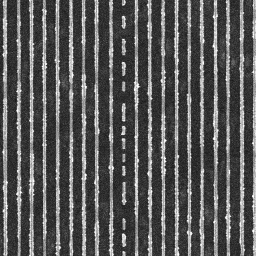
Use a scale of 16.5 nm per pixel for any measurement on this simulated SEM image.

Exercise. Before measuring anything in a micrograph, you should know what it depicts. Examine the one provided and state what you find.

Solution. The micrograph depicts parallel lines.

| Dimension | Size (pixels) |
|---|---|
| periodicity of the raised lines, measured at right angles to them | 13.2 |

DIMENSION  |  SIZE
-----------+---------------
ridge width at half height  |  43.3 nm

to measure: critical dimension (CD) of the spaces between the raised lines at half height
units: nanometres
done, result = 167